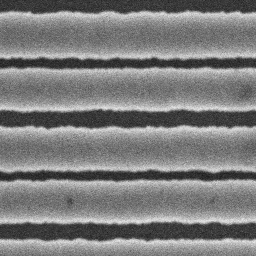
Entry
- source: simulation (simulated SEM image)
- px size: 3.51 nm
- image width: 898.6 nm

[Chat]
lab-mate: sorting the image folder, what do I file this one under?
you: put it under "lines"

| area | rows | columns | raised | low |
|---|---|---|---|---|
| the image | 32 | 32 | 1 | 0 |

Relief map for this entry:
00000000000000000000000000000000
01110001100001000110000110000100
11111111111111111111111111111111
11111111111111111111111111111111
11111111111111111111111111111111
11111111111111111111111111111111
11111111111111111111111111111111
00000000000000000000000000000000
00000000000000000000000000000000
11111111111111111111111111111111
11111111111111111111111111111111
11111111111111111111111111111111
11111111111111111111111111111111
11111111111111111111111111111111
00000000000000000000000000000000
00000000000000000000000000000000
11111111111111111111111111111111
11111111111111111111111111111111
11111111111111111111111111111111
11111111111111111111111111111111
11111111111111111111111111111111
00000000000000000000000000000000
00000000000000000000000000000000
11111111111111111111111111111111
11111111111111111111111111111111
11111111111111111111111111111111
11111111111111111111111111111111
11111111111111111111111111111111
00000000000000000000000000000000
00000000000000000000000000000000
11111111111111111111111111111111
11111111111111111111111111111111